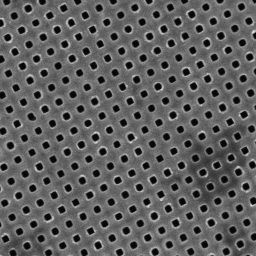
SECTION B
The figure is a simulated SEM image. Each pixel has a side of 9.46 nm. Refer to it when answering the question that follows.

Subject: a regular array of holes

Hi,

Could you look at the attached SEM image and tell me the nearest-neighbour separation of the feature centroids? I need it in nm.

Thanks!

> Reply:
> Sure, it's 148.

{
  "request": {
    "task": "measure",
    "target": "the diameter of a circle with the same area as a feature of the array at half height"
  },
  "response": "65.8 nm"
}